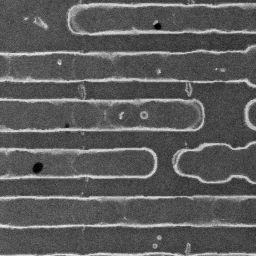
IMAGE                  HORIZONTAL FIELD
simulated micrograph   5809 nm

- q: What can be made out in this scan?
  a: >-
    wiring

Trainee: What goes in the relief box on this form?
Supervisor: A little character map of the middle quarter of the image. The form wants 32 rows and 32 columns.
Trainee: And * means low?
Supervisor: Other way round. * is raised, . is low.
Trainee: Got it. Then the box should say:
********************************
********************************
********************************
********************************
................................
................................
................................
................................
................................
*********...********************
********************************
********************************
********************************
********************************
********************************
********************************
............................**..
................................
................................
................................
................................
............*********...........
***********************......***
***********************.....****
***********************.....****
***********************.....****
***********************.....****
**********************.......***
................................
................................
................................
................................